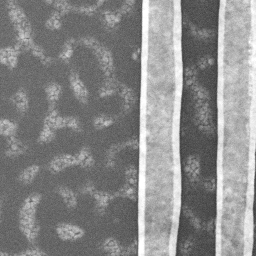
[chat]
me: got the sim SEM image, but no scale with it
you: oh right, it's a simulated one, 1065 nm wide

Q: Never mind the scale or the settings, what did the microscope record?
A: one or a few lines or trenches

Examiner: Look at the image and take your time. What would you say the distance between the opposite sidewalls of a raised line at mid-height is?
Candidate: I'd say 137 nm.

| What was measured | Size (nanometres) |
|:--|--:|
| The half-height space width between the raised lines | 180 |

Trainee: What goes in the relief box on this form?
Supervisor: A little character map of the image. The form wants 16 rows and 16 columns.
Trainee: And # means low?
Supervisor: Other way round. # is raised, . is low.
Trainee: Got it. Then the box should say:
.........##...##
.........##...##
.........##...##
.........##...##
.........##...##
.........##...##
.........##...##
.........##...##
.........##...##
.........##...##
.........##...##
.........##...##
.........##...##
.........##...##
.........##...##
.........##...##